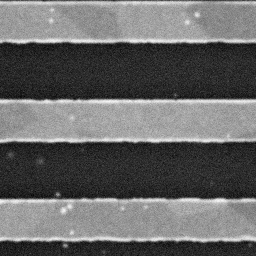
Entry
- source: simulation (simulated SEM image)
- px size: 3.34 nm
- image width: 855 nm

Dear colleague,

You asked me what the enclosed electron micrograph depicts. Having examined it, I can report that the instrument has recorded lines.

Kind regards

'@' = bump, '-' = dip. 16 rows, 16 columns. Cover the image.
@@@@@@@@@@@@@@@@
@@@@@@@@@@@@@@@@
@@@@@@@@@@@@@@@@
----------------
----------------
----------------
@@@@@@@@@@@@@@@@
@@@@@@@@@@@@@@@@
@@@@@@@@@@@@@@@@
----------------
----------------
----------------
-----@@@-@-@@--@
@@@@@@@@@@@@@@@@
@@@@@@@@@@@@@@@@
----------------